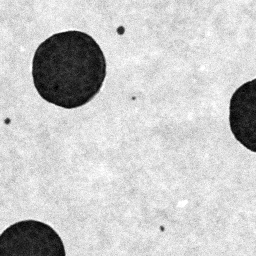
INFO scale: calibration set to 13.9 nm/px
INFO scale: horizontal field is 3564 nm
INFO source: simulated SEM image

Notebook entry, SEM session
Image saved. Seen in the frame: holes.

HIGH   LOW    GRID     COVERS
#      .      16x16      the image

################
################
###...##########
##....##########
##.....#########
##....#########.
###..#########..
##############..
###############.
################
################
################
################
################
...#############
....############